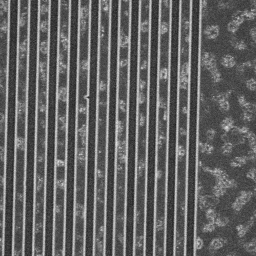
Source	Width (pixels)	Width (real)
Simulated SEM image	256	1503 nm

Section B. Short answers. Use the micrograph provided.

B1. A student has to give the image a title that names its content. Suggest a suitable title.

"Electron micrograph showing parallel lines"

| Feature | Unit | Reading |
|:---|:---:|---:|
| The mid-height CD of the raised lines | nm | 65.3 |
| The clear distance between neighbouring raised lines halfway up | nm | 55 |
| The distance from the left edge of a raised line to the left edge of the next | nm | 119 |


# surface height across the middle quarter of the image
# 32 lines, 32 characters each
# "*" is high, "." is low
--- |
*..***...**...**...**...**...**.
*..***...**..***...**...**...**.
*..***...**..***...**...**...**.
*..***...**..***...**...**...**.
*..***...**..***...**...**...**.
*..***..***..***...**...**...**.
*..***..***..***..***...**...**.
*..***..***..***..***...**...**.
*..***..***..***..***...**...**.
*..***..***..***..***...**...**.
*..***..***..***..***...**...**.
*..***..***..***..***..***...**.
*..***..***..***..***..***...**.
*..***..***..***..***..***...**.
*..***..***..***..***..***...**.
*..***..***..***..***..***...**.
*..***..***..***..***..***..***.
*..***..***..***..***..***..***.
...***..***..***..***..***..***.
...***..***..***..***..***..***.
...***..***..***..***..***..***.
...***..***..***..***..***..***.
...***..***..***..***..***..***.
...**...***..***..***..***..***.
...**...***..**...***..***..***.
...**...***..**...***..***..***.
...**...***..**...***..***..***.
...**...***..**...***..***..***.
...**...**...**...***..***..***.
...**...**...**...**...***..***.
...**...**...**...**...***..**..
...**...**...**...**...***..**..